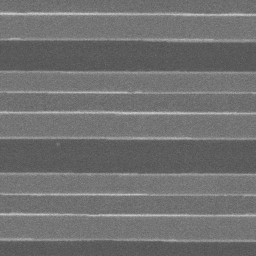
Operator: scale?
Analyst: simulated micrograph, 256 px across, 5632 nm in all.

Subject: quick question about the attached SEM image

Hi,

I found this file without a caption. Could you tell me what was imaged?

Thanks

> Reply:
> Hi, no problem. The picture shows lines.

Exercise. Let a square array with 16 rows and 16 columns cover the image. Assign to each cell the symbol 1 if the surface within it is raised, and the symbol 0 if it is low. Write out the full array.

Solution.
1111111111111111
1111111111111111
0000000000000001
0000000000000000
0000000000000000
1111111111111111
1111111111111111
1111111111111111
1111111111111111
0000000000000000
0000000000000000
1111111111111111
1111111111111111
1111111111111111
1111111111111111
0000000000000000